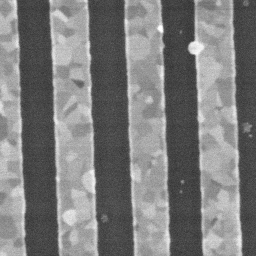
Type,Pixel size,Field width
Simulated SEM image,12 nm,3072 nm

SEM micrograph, lines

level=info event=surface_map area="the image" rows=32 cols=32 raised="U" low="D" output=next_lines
UUDDDDUUUUUDDDDDUUUUDDDDUUUUUDDD
UUDDDDUUUUUDDDDDUUUUDDDDUUUUUDDD
UUDDDDUUUUUDDDDDUUUUDDDDUUUUUDDD
UUDDDDUUUUUDDDDDUUUUDDDDUUUUUDDD
UUDDDDUUUUUDDDDDUUUUDDDDUUUUUDDD
UUDDDDDUUUUDDDDDUUUUDDDDUUUUUDDD
UUDDDDDUUUUDDDDDUUUUDDDDUUUUUDDD
UUDDDDDUUUUDDDDDUUUUDDDDDUUUUDDD
UUDDDDDUUUUDDDDDUUUUDDDDDUUUUDDD
UUDDDDDUUUUDDDDDUUUUDDDDDUUUUDDD
UUUDDDDUUUUDDDDDUUUUDDDDDUUUUDDD
UUUDDDDUUUUDDDDDUUUUUDDDDUUUUDDD
UUUDDDDUUUUDDDDDUUUUUDDDDUUUUDDD
UUUDDDDUUUUDDDDDUUUUUDDDDUUUUDDD
UUUDDDDUUUUDDDDDUUUUUDDDDUUUUUDD
UUUDDDDUUUUUDDDDUUUUUDDDDUUUUUDD
UUUDDDDUUUUUDDDDUUUUUDDDDUUUUUDD
UUUDDDDUUUUUDDDDUUUUUDDDDUUUUUDD
UUUDDDDUUUUUDDDDUUUUUDDDDUUUUUDD
UUUDDDDUUUUUDDDDUUUUUDDDDUUUUUDD
UUUDDDDUUUUUDDDDUUUUUDDDDUUUUUDD
UUUDDDDUUUUUDDDDUUUUUDDDDUUUUUDD
UUUDDDDUUUUUDDDDUUUUUDDDDUUUUUDD
UUUDDDDUUUUUDDDDUUUUUDDDDUUUUUDD
UUUDDDDUUUUUDDDDUUUUUDDDDUUUUUDD
UUUDDDDUUUUUDDDDUUUUUDDDDUUUUUDD
UUUDDDDUUUUUDDDDDUUUUDDDDUUUUUDD
UUUDDDDUUUUUDDDDDUUUUDDDDUUUUUDD
UUUDDDDUUUUUDDDDDUUUUDDDDUUUUUDD
UUUDDDDUUUUUDDDDDUUUUDDDDUUUUUDD
UUUDDDDUUUUUDDDDDUUUUDDDDUUUUUDD
UUUDDDDUUUUUDDDDDUUUUDDDDUUUUUDD